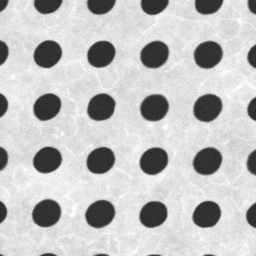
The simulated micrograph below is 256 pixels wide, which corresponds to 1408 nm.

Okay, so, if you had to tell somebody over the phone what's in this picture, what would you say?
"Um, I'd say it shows a regular array of holes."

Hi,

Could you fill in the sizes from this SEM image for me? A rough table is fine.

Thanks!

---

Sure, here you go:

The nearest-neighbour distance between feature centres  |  292 nanometers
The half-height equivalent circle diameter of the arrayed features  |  150 nanometres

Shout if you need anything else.